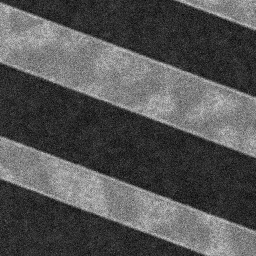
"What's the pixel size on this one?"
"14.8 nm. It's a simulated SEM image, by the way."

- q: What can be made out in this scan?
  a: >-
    one or a few lines or trenches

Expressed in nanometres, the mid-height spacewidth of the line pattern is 1060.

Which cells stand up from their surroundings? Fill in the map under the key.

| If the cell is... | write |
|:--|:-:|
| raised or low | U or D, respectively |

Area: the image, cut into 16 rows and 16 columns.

UDDDDDDDDDDDDUUU
UUUDDDDDDDDDDDDU
UUUUUUDDDDDDDDDD
UUUUUUUUUDDDDDDD
DDUUUUUUUUUDDDDD
DDDDDUUUUUUUUUDD
DDDDDDDUUUUUUUUU
DDDDDDDDDDUUUUUU
DDDDDDDDDDDDDUUU
UUUDDDDDDDDDDDDU
UUUUUDDDDDDDDDDD
DUUUUUUUDDDDDDDD
DDDDUUUUUUUDDDDD
DDDDDDDUUUUUUDDD
DDDDDDDDDUUUUUUU
DDDDDDDDDDDDUUUU